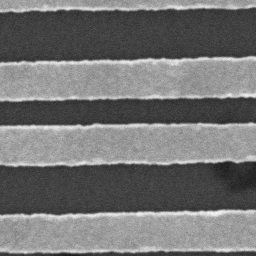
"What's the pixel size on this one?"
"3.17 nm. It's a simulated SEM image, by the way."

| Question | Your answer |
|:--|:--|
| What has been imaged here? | lines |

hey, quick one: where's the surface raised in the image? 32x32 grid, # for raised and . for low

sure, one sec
################################
................................
................................
................................
................................
................................
................................
.................###############
################################
################################
################################
################################
###.............................
................................
................................
...............................#
################################
################################
################################
################################
##############.....##...........
................................
................................
................................
................................
................................
.......................#.#######
################################
################################
################################
################################
.############...#...............